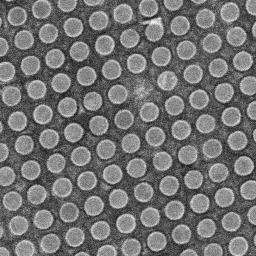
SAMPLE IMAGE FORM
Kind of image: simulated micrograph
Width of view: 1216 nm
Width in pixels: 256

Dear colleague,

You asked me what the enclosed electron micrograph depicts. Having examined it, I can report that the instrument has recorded a regular array of raised bodies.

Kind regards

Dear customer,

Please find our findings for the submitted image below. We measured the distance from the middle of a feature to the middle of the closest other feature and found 119 nm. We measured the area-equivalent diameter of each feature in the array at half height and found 88 nanometres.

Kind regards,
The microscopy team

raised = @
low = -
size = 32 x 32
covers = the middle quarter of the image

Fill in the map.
----------@@@@--@@@@------------
----@@@---@@@@---@@@----------@@
---@@@@@--@@@@----------@@@---@@
@--@@@@@---@@-----------@@@@--@@
@---@@@-----------------@@@@---@
@------------@----------@@@@----
@-----------@@@@----------------
------@@@--@@@@@----------------
@----@@@@--@@@@@-----------@@--@
@@@--@@@@---@@@-----------@@@@-@
@@@--@@@@-----------@@@--@@@@@--
@@@----@-----------@@@@@--@@@@--
@@-----------@@@@--@@@@----@----
-------@@@---@@@@--@@@@---------
-------@@@@--@@@@-----------@@--
-@@@--@@@@@--@@@-----------@@@@-
@@@@@--@@@@----------@@@---@@@@-
@@@@@---@------------@@@@--@@@@-
-@@@-----------@@@@--@@@@---@@--
---------@@@---@@@@--@@@@-------
---------@@@@--@@@@------------@
---@@@--@@@@@--@@@-----------@@@
--@@@@--@@@@-----------@@@---@@@
--@@@@---@@-----------@@@@@--@@@
--@@@@-----------@@@--@@@@@--@@@
-----------@@---@@@@---@@@------
----------@@@@--@@@@----@-------
----@@@---@@@@--@@@@-----------@
----@@@@--@@@@-----------@@@--@@
@@--@@@@---@@@----------@@@@--@@
@@--@@@@----------@@@@--@@@@@--@
@@-----------@----@@@@--@@@@----